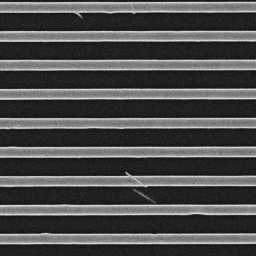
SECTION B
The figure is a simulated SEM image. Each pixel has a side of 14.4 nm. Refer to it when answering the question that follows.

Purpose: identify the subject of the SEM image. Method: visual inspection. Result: parallel lines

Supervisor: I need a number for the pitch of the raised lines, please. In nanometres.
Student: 418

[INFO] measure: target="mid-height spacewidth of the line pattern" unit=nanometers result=282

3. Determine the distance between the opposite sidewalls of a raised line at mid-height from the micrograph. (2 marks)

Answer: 9.75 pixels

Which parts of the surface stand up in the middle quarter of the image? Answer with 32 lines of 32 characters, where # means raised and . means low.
################################
................................
................................
................................
................................
................................
################################
################################
################################
................................
................................
................................
................................
................................
################################
################################
................................
................................
................................
................................
................................
################################
################################
................................
................................
................................
................................
................................
################################
################################
....................#...........
................................